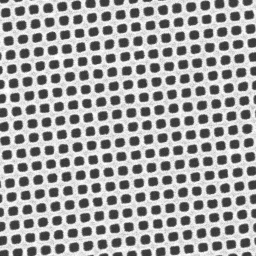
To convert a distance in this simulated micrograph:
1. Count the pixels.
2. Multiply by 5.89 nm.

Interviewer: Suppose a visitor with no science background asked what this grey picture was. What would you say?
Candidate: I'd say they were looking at a regular array of holes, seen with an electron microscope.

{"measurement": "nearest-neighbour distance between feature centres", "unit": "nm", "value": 81.7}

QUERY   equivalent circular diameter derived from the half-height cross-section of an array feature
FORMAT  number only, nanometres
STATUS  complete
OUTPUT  62